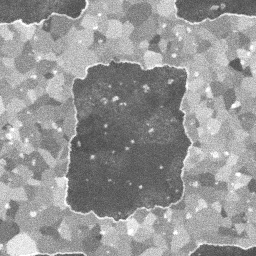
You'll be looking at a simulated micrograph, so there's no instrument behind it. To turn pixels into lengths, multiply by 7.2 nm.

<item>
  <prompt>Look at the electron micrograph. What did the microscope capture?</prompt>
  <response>holes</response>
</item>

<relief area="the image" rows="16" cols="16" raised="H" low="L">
LLLLLHHHHHHLLLLL
HHHHHHHHHHHHHHHH
HHHHHHHHHHHHHHHH
HHHHHHHHHHHHHHHH
HHHHHLLLLLLLHHHH
HHHHHLLLLLLLHHHH
HHHHHLLLLLLHHHHH
HHHHHLLLLLLHHHHH
HHHHHLLLLLLLHHHH
HHHHLLLLLLLLHHHH
HHHHLLLLLLLHHHHH
HHHHLLLLLLLHHHHH
HHHHLLLLLLLHHHHH
HHHHHHLLHHHHHHHH
HHHHHHHHHHHHHHHH
HHHHHHHHHHHHLLLL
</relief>